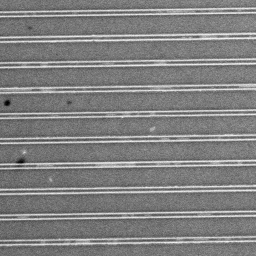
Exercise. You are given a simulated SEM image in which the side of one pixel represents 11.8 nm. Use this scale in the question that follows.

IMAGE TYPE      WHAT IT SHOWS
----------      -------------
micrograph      parallel lines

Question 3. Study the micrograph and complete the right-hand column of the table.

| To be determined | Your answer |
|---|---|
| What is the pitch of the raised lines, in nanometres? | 299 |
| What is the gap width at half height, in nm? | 243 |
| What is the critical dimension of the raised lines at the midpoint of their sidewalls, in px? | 4.5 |